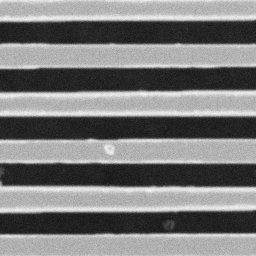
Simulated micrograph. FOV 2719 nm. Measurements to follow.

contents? lines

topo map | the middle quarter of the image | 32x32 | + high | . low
++++++++++++++++++++++++++++++++
................................
................................
................................
................................
................................
................................
++++++++++++++++++++++++++++++++
++++++++++++++++++++++++++++++++
++++++++++++++++++++++++++++++++
++++++++++++++++++++++++++++++++
++++++++++++++++++++++++++++++++
++++++++++++++++++++++++++++++++
................................
................................
................................
................................
................................
................................
++++++++++++++++++++++++++++++++
++++++++++++++++++++++++++++++++
++++++++++++++++++++++++++++++++
++++++++++++++++++++++++++++++++
++++++++++++++++++++++++++++++++
+++++++.++++++++++++++++++++++++
................................
................................
................................
................................
................................
................................
++++++++++++++++++++++++++++++++